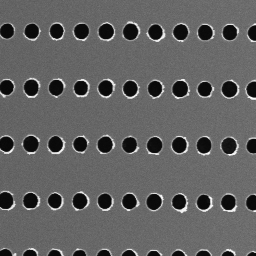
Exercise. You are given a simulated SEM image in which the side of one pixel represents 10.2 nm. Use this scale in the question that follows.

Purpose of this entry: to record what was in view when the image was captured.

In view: a regular array of holes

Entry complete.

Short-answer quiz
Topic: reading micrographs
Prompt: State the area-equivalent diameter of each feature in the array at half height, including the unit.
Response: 154 nm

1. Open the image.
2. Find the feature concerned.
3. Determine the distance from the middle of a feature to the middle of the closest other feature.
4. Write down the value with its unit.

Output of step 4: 252 nm